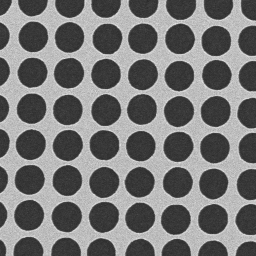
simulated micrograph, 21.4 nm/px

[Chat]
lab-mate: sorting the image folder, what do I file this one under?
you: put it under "a regular array of holes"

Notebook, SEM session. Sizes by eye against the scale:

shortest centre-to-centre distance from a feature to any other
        0.757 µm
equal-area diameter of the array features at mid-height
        650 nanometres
